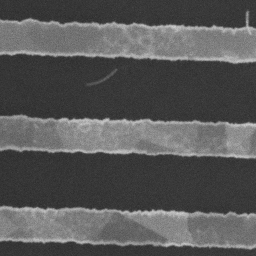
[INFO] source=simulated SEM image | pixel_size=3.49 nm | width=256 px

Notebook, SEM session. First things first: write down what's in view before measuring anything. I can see lines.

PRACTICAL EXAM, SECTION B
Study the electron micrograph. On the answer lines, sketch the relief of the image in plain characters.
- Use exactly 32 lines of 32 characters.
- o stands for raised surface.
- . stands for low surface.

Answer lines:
................................
................................
...o............................
oooooooooooooooooooooooooooo..o.
oooooooooooooooooooooooooooooooo
oooooooooooooooooooooooooooooooo
oooooooooooooooooooooooooooooooo
..........................oooooo
................................
................................
................................
................................
................................
................................
.oo.............................
ooooooooooooooooooooooooooooo.oo
oooooooooooooooooooooooooooooooo
oooooooooooooooooooooooooooooooo
oooooooooooooooooooooooooooooooo
............................oooo
................................
................................
................................
................................
................................
................................
oooooooooooooooo.ooooo..........
oooooooooooooooooooooooooooooooo
oooooooooooooooooooooooooooooooo
oooooooooooooooooooooooooooooooo
...............o.o.ooooooooooooo
................................